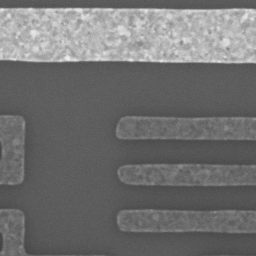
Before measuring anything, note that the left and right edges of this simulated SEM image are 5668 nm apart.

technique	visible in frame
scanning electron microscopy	wiring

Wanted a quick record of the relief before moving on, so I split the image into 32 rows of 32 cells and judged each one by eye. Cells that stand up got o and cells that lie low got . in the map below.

................................
oooooooooooooooooooooooooooooooo
oooooooooooooooooooooooooooooooo
oooooooooooooooooooooooooooooooo
oooooooooooooooooooooooooooooooo
oooooooooooooooooooooooooooooooo
oooooooooooooooooooooooooooooooo
.ooooooooooooooooooooooooooooooo
................................
................................
................................
................................
................................
................................
................................
ooo............ooooooooooooooooo
ooo............ooooooooooooooooo
ooo.............................
ooo.............................
ooo.............................
ooo.............................
ooo............ooooooooooooooooo
ooo............ooooooooooooooooo
................................
................................
................................
ooo............ooooooooooooooooo
ooo............ooooooooooooooooo
ooo............ooooooooooooooooo
ooo.............................
ooo.............................
ooo.............................